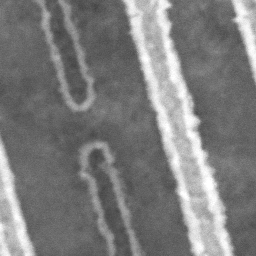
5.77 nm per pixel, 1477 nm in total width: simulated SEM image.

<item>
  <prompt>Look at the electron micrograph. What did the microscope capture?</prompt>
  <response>one or a few lines or trenches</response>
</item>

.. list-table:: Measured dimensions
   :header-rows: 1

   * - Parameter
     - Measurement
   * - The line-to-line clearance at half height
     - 376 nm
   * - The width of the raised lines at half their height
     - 137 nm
